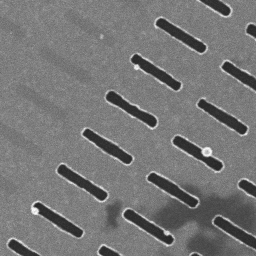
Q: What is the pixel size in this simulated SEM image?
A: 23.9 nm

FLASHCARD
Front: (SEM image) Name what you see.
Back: a regular array of holes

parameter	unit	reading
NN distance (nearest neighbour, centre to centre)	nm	1060